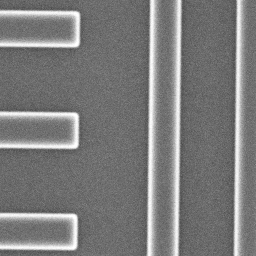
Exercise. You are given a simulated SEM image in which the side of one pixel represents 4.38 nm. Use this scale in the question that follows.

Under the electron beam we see groups of lines, slits or small figures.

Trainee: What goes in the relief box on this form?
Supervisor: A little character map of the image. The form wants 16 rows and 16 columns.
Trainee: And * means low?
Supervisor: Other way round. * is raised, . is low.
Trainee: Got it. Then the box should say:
..........*....*
*****....**....*
*****....**....*
.........**....*
.........**....*
.........**....*
.........**....*
*****....**....*
*****....**....*
.........**....*
.........**....*
.........**....*
.........**....*
****.....**....*
*****....**....*
****.....**....*